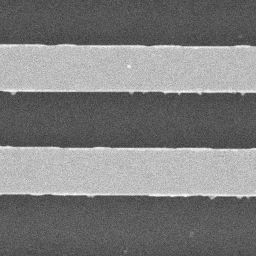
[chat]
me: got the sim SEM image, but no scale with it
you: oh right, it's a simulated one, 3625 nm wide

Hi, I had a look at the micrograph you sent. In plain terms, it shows lines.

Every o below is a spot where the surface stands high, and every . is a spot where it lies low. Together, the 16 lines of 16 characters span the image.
................
................
................
oooooooooooooooo
oooooooooooooooo
oooooooooooooooo
................
................
................
oooooooooooooooo
oooooooooooooooo
oooooooooooooooo
................
................
................
................